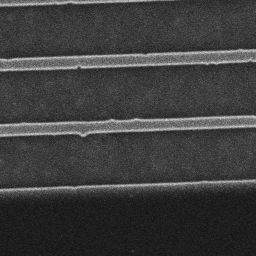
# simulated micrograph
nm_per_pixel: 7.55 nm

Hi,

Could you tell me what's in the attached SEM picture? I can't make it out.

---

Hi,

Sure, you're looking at one or a few lines or trenches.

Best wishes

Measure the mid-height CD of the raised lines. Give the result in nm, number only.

81.1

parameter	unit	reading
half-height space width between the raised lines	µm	0.407